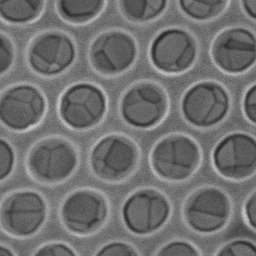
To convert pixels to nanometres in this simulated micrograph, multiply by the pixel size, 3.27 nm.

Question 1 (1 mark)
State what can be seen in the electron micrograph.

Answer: a regular array of holes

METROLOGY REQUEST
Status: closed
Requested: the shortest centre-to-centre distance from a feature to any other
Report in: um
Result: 0.199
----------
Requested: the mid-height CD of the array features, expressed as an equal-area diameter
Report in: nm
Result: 147